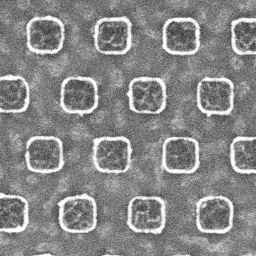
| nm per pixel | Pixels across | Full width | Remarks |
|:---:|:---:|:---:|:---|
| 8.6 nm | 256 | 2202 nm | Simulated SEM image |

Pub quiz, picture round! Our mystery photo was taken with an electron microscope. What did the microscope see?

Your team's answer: a regular array of raised bodies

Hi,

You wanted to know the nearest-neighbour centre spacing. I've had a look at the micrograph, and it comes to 582 nm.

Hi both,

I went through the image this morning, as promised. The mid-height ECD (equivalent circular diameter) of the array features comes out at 330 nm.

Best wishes